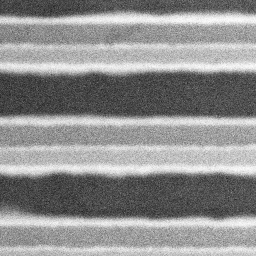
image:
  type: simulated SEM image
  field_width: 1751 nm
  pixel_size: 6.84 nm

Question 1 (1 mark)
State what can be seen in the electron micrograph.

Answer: lines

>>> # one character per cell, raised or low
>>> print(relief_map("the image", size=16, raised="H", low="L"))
LLLLLLLLLLLLLLLL
HHHHHHHHHHHHHHHH
HHHHHHHHHHHHHHHH
HHHHHHHHHHHHHHHH
LLLLLLLLLLLLLLLL
LLLLLLLLLLLLLLLL
LLLLLLLLLLLLLLLL
LLLLLLLLLLLLLLLL
HHHHHHHHHHHHHHHH
HHHHHHHHHHHHHHHH
HHHLHLHHHHLHHHHH
LLLLLLLLLLLLLLLL
LLLLLLLLLLLLLLLL
LLLLLLLLLLLLLLLL
HHHHHHHHHHHHHHHH
HHHHHHHHHHHHHHHH